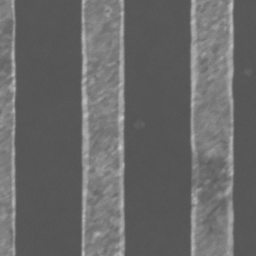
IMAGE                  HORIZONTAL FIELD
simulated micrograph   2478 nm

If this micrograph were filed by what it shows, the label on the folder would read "wiring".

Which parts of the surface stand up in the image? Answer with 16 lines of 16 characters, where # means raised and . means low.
#....###....##..
#....###....##..
#....###....##..
#....###....##..
#....###....##..
#....###....##..
#....###....###.
#....###....###.
#....###....###.
#....###....##..
#....###....##..
#....###....##..
#....###....##..
#....###....##..
#....###....##..
#....###....##..